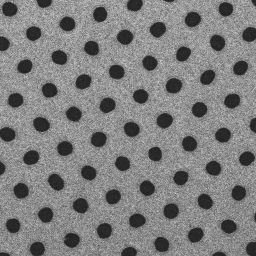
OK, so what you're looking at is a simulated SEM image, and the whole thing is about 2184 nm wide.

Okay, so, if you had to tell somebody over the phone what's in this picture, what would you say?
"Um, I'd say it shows a regular array of holes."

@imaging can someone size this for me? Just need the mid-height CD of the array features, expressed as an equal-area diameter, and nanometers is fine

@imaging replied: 127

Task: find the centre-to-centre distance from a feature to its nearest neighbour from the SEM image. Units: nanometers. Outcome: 289